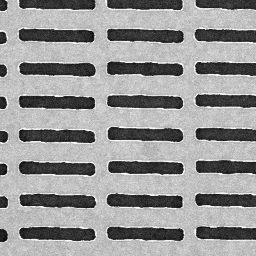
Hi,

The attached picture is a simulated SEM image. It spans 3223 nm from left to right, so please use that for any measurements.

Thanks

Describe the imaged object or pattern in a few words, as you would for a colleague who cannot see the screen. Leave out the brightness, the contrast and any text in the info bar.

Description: a regular array of holes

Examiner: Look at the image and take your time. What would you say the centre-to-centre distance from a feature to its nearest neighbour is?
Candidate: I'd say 0.414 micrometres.